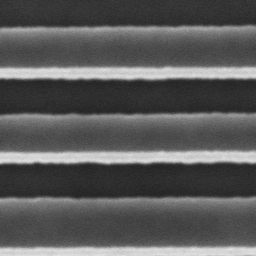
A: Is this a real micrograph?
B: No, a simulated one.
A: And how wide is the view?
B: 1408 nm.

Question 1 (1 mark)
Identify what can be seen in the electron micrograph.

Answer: lines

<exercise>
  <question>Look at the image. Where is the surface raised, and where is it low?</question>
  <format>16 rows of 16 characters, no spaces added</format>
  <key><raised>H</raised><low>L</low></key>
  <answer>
LLLLLLLLLLLLLLLL
LLLLLLLLLLLLLLLL
HHHHHHHHHHHHHHHH
HHHHHHHHHHHHHHHH
HHHHHHHHHHHHHHHH
LLLLLLLLLLLLLLLL
LLLLLLLLLLLLLLLL
HHHHHHHHHHHHHHHH
HHHHHHHHHHHHHHHH
HHHHHHHHHHHHHHHH
LLLLLLLLLLLLLLLL
LLLLLLLLLLLLLLLL
HHHHHHHHHHHHHHHH
HHHHHHHHHHHHHHHH
HHHHHHHHHHHHHHHH
HHHHHHHHHHHHHHHH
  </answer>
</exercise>